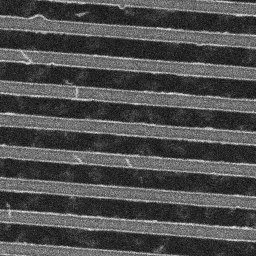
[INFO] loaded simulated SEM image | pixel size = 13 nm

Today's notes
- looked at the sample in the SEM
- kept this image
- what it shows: parallel lines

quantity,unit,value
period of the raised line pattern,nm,419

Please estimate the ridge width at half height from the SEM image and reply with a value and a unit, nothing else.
273 nm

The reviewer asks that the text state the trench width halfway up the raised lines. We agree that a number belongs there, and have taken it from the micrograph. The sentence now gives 142 nm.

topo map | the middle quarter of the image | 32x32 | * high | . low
**..............................
*************.*.................
****..**********************....
********************************
********************************
.*******************************
...............*****************
............................****
................................
***********.....................
************************........
********************************
********************************
********************************
.............*******************
..........................******
................................
***********.....................
************************........
********************************
********************************
********************************
...........*********************
..........................******
................................
************....................
**********************..........
********************************
********************************
********************************
...........*********************
........................********